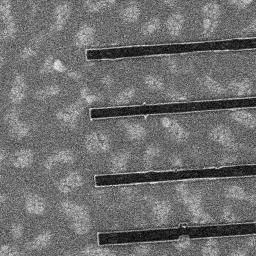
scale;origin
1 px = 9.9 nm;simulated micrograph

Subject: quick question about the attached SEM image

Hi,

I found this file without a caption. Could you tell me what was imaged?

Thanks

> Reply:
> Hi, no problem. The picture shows one or a few lines or trenches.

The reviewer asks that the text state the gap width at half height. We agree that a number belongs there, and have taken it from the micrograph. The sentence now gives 479 nm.